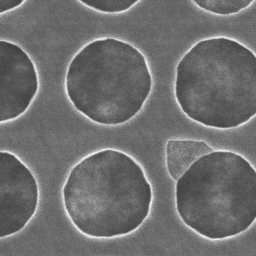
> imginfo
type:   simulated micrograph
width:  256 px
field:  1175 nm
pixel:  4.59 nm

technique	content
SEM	holes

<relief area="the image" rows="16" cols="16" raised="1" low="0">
0111110011111001
1111111111111111
1111110111111011
0011100001110000
0011000001100000
0011000001100000
0011100001100000
0111110011110000
1111111111111111
1111110111000011
0011100001100000
0011000001100000
0011000001100000
0011000001100000
0111100011110001
1111111111111111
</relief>